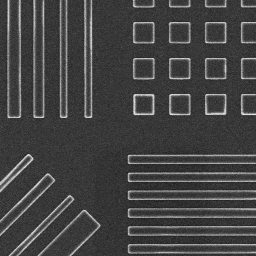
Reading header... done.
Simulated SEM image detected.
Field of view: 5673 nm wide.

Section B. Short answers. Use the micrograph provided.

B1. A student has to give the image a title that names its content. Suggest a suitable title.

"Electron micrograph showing groups of lines, slits or small figures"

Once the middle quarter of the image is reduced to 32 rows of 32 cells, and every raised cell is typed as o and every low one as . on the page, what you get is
.....oo..........ooooo.....oooo.
.....oo..........ooooo.....oooo.
.....oo..........ooooo.....oooo.
.....oo...........oooo.....oooo.
.....oo.........................
.....oo.........................
.....oo.........................
o....oo.........................
o....oo..........ooooo.....oooo.
o....oo...........oooo.....oooo.
o....oo...........oooo.....oooo.
o....oo...........oooo.....oooo.
o....oo...........oooo.....oooo.
................................
................................
................................
................................
................................
................................
................................
................................
................................
................................
................oooooooooooooooo
................oooooooooooooooo
................................
................................
................oooooooooooooooo
................oooooooooooooooo
................................
................................
................................